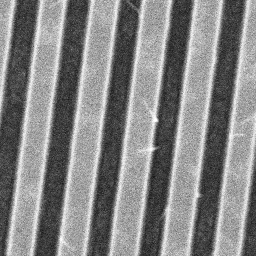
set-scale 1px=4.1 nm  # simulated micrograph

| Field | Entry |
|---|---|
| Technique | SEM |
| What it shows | parallel lines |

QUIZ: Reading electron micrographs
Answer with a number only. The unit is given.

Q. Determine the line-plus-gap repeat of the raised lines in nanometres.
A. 210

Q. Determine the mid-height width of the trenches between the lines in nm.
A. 93.9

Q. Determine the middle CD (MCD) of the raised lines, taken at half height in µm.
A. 0.118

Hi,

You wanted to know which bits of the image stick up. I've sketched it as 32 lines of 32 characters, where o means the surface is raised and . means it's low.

oo...ooo...oooo...ooo...oooo...o
oo...ooo...oooo...ooo...oooo...o
oo...ooo...oooo..oooo...oooo...o
oo...ooo...ooo...oooo...ooo...oo
o...oooo...ooo...oooo...ooo...oo
o...oooo...ooo...oooo...ooo...oo
o...oooo..oooo...oooo..oooo...oo
o...ooo...oooo...oooo..oooo...oo
o...ooo...oooo...ooo...oooo...oo
o...ooo...oooo...ooo...oooo...oo
....ooo...oooo..oooo...oooo..ooo
...oooo...ooo...oooo...ooo...ooo
...oooo...ooo...oooo...ooo...ooo
...oooo...ooo...oooo...ooo...ooo
...ooo...oooo...oooo..oooo...ooo
...ooo...oooo...oooo..oooo...ooo
...ooo...oooo...ooo...oooo...ooo
...ooo...oooo...ooo...oooo...ooo
...ooo...oooo..oooo...oooo..oooo
..oooo...ooo...oooo...ooo...oooo
..oooo...ooo...oooo...ooo...oooo
..oooo...ooo...oooo..oooo...ooo.
..ooo...oooo...ooo...oooo...ooo.
..ooo...oooo...ooo...oooo...ooo.
..ooo...oooo...ooo...oooo...ooo.
..ooo...oooo..oooo...oooo..oooo.
..ooo...ooo...oooo...ooo...oooo.
.oooo...ooo...oooo...ooo...oooo.
.oooo...ooo...oooo...ooo...oooo.
.oooo..oooo...oooo..oooo...ooo..
.ooo...oooo...oooo..oooo...ooo..
.ooo...oooo...ooo...oooo...ooo..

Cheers